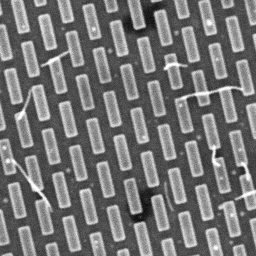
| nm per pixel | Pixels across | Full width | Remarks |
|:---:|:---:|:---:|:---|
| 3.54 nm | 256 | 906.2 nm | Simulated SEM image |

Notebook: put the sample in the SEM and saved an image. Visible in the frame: groups of lines, slits or small figures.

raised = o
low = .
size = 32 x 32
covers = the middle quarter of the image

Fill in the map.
..oo....ooo....oo...ooo..oooo...
.........oo...ooo...ooo...ooo...
.........ooo..ooo.........ooo...
...ooo...ooo...ooo........ooo...
...ooo...oo....ooo...oo....oo...
....oo.........ooo...ooo...ooo..
o...ooo........ooo...ooo........
....ooo...ooo...oo....oo........
....ooo...ooo...oo....ooo....oo.
....ooo...ooo.........ooo...ooo.
oo...oo...ooo.........ooo...ooo.
oo.........oo....oo...ooo...ooo.
oo.........ooo...ooo...oo....oo.
oo.........ooo...ooo.........ooo
ooo...oo...ooo...ooo.........ooo
ooo...ooo...o....ooo....oo...ooo
ooo...ooo.........ooo...oo...ooo
ooo...ooo.........ooo...ooo.....
.......oo....oo...ooo...ooo.....
.......ooo...oo....o....ooo.....
...o...ooo...ooo.........oo...oo
..oo...ooo...ooo.........ooo..oo
..ooo........ooo....oo...ooo...o
..ooo.........oo...ooo...ooo...o
..ooo.........ooo...oo.........o
..ooo...ooo...ooo...ooo.........
...oo....oo.........ooo...ooo...
...ooo...ooo........ooo...ooo...
...ooo...ooo.........oo...ooo...
.........ooo...ooo...ooo...ooo..
.........ooo...ooo...oo....ooo..
o...ooo...oo...ooo.........ooo..